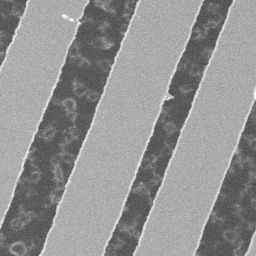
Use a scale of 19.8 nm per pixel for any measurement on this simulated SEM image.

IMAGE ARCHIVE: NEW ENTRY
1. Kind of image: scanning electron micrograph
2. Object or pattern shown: one or a few lines or trenches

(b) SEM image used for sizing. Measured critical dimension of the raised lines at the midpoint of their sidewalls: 1.13 micrometres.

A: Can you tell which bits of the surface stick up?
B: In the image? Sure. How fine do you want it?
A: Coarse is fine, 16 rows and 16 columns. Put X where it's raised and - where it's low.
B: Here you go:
--XXX----XXX--XX
-XXXX---XXXX--XX
-XXXX---XXXX--XX
XXXX---XXXX--XXX
XXXX---XXXX--XXX
XXX----XXXX-XXXX
XXX---XXXX--XXXX
XXX---XXXX--XXX-
XX---XXXX--XXXX-
XX---XXXX--XXXX-
X----XXXX-XXXX--
X---XXXX--XXXX--
X---XXXX--XXX---
---XXXX--XXXX---
---XXXX--XXXX---
---XXXX--XXX----